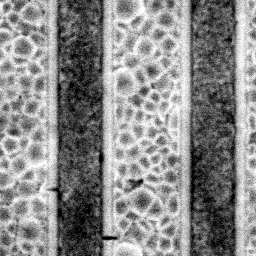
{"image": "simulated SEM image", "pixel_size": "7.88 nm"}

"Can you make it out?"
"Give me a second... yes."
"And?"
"one or a few lines or trenches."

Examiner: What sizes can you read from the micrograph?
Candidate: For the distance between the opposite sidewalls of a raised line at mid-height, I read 0.619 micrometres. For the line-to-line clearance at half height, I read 424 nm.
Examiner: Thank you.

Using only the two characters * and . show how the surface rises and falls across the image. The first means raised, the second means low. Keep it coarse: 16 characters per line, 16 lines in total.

***....*****...*
***....*****...*
***....*****...*
***....*****...*
***....*****...*
***....*****...*
***....*****...*
***....*****...*
***....*****...*
***....*****...*
***....*****...*
***....*****...*
***....*****...*
***....*****...*
***....*****...*
***....*****...*